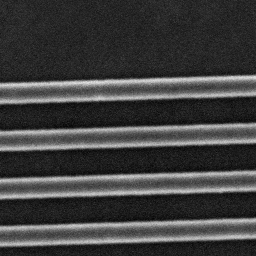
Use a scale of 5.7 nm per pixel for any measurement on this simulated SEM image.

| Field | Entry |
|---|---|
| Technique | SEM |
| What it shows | parallel lines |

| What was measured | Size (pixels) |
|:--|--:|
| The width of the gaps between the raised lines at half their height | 29.4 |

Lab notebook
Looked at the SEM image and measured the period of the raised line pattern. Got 271 nm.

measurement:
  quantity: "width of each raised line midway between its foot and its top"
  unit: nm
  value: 105